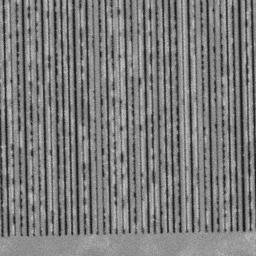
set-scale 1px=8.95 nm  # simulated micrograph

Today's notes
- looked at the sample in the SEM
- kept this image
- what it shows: parallel lines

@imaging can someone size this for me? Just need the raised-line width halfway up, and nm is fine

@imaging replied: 39.1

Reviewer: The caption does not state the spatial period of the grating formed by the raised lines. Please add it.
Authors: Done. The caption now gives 56.9 nanometers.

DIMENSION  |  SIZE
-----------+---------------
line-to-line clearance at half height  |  15.7 nanometers